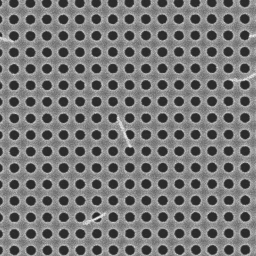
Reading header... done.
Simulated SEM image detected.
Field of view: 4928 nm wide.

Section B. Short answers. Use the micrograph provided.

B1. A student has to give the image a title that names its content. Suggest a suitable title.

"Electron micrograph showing a regular array of holes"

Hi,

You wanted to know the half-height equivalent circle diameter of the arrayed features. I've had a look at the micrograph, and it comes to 194 nm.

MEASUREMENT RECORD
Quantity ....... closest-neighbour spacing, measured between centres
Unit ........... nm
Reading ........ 313